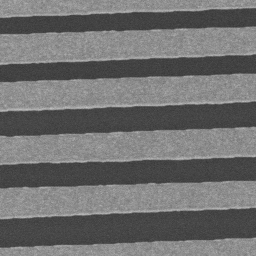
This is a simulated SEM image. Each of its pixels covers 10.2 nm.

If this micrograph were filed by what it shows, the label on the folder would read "lines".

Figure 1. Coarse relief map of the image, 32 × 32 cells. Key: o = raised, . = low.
oooooooooooooooooooooooooooooooo
oooooooooooooooo................
................................
..............................oo
oooooooooooooooooooooooooooooooo
oooooooooooooooooooooooooooooooo
oooooooooooooooooooooooooooooooo
ooooooooooooo...................
................................
..........................oooooo
oooooooooooooooooooooooooooooooo
oooooooooooooooooooooooooooooooo
oooooooooooooooooooooooooooooooo
oooooooooo......................
................................
................................
................oooooooooooooooo
oooooooooooooooooooooooooooooooo
oooooooooooooooooooooooooooooooo
oooooooooooooooooooooooooooooooo
................................
................................
................................
...o.ooooooooooooooooooooooooooo
oooooooooooooooooooooooooooooooo
oooooooooooooooooooooooooooooooo
ooooooooooooooooo...............
................................
................................
................................
..............oooooooooooooooooo
oooooooooooooooooooooooooooooooo